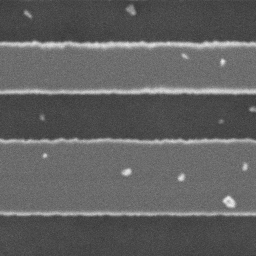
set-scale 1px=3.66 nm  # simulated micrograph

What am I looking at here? lines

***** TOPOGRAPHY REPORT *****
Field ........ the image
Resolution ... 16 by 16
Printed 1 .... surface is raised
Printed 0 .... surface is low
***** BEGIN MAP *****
0000000000000000
0000000000000000
0000000000000000
1111111111111111
1111111111111111
1111111111111111
0000000000000000
0000000000000000
0000000000000000
1111111111111111
1111111111111111
1111111111111111
1111111111111111
0000000000000000
0000000000000000
0000000000000000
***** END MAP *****